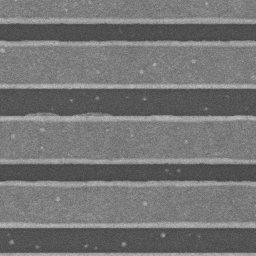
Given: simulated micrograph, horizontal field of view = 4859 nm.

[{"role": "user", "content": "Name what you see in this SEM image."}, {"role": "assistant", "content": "lines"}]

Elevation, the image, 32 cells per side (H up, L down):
HHHHHHHHHHHHHHHHHHHHHHHHHHHHHHHH
HHHHHHHHHHHHHHHHHHHHHHHHHHHHHHHH
HHHHHHHHHHHHHHHHHHHHHHHHHHHHHHHH
LLLLLLLLLLLLLLLLLLLLLLLLLLLLLLLL
LLLLLLLLLLLLLLLLLLLLLLLLLLLLLLLL
HHHHHHHHHHHHHHHHHHHHHHHHHHHHHHHH
HHHHHHHHHHHHHHHHHHHHHHHHHHHHHHHH
HHHHHHHHHHHHHHHHHHHHHHHHHHHHHHHH
HHHHHHHHHHHHHHHHHHHHHHHHHHHHHHHH
HHHHHHHHHHHHHHHHHHHHHHHHHHHHHHHH
HHHHHHHHHHHHHHHHHHHHHHHHHHHHHHHH
LLLLLLLLLLLLLLLLLLLLLLLLLLLLLLLL
LLLLLLLLLLLLLLLLLLLLLLLLLLLLLLLL
LLLLLLLLLLLLLLLLLLLLLLLLLLLLLLLL
LLLLLLLLLLLLLLLLLLLLLLLLLLLLLLLL
HHHHHHHHHHHHHHHHHHHHHHHHHHHHHHHH
HHHHHHHHHHHHHHHHHHHHHHHHHHHHHHHH
HHHHHHHHHHHHHHHHHHHHHHHHHHHHHHHH
HHHHHHHHHHHHHHHHHHHHHHHHHHHHHHHH
HHHHHHHHHHHHHHHHHHHHHHHHHHHHHHHH
LLLLLLLLLLLLLLLLLLLLLLLLLLLLLLLL
LLLLLLLLLLLLLLLLLLLLLLLLLLLLLLLL
LLLLLLLLLLLLLLLLLLLLLLLLLLLLLLLL
HHHHHHHHHHHHHHHHHHHHHHHHHHHHHHHH
HHHHHHHHHHHHHHHHHHHHHHHHHHHHHHHH
HHHHHHHHHHHHHHHHHHHHHHHHHHHHHHHH
HHHHHHHHHHHHHHHHHHHHHHHHHHHHHHHH
HHHHHHHHHHHHHHHHHHHHHHHHHHHHHHHH
LLLLLLLLLLLLLLLLLLLLLLLLLLLLLLLL
LLLLLLLLLLLLLLLLLLLLLLLLLLLLLLLL
LLLLLLLLLLLLLLLLLLLLLLLLLLLLLLLL
LLLLLLLLLLLLLLLLLLLLLLLLLLLLLLLL